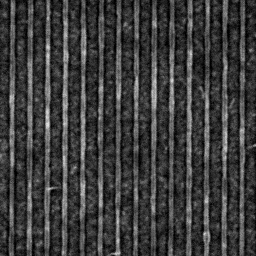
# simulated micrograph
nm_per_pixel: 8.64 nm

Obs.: parallel lines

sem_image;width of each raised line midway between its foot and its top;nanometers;30.2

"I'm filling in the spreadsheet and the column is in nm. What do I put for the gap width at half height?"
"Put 120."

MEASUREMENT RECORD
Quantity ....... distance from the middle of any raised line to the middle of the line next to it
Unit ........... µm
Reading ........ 0.153